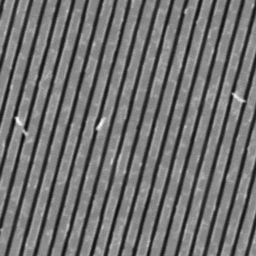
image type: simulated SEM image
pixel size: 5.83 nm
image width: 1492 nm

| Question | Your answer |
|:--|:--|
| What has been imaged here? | parallel lines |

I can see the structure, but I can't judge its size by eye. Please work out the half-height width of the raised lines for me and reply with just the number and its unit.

55 nanometres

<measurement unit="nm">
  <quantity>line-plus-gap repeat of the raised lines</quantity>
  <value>79.6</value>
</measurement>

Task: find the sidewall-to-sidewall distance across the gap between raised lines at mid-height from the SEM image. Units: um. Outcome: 0.0247